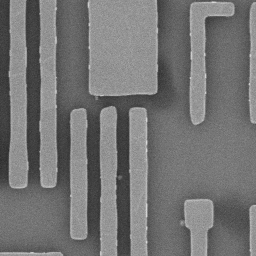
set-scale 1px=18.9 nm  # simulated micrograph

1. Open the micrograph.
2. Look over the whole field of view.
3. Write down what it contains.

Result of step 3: wiring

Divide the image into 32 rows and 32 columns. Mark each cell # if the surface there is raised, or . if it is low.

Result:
.##..##....#########....#####...
.##..##....#########....#####..#
.##..##....#########....##.....#
.##..##....#########....##.....#
.##..##....#########....##.....#
.##..##....#########....##.....#
.##..##....#########....##.....#
.##..##....#########....##.....#
.##..##....#########....##.....#
.##..##....#########....##.....#
.##..##....#########....##.....#
.##..##....########.....##.....#
.##..##.................##.....#
.##..##......#..........##.....#
.##..##..##..##.##......##.....#
.##..##..##..##.##......#.......
.##..##..##..#..##..............
.##..##..##..##.##..............
.##..##..##..##.##..............
.##..##..##..##.##..............
.##..##..##..##.##..............
.##..##..##..##.##..............
.##..##..##..##.##..............
.........##..#..##..............
.........##..#..##..............
.........##..##.##.....####.....
.........##..##.##.....####....#
.........##..##.##.....####....#
.........##..##.##......##.....#
.........##..##.##......##.....#
.............##.##......##.....#
.............##.##......##.....#